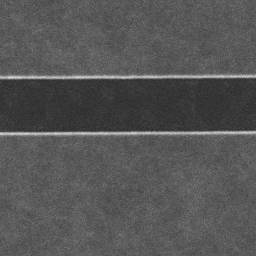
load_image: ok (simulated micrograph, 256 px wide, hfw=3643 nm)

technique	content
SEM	one or a few lines or trenches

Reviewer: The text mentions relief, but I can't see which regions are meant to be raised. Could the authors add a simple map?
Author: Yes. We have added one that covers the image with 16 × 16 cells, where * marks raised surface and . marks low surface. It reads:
****************
****************
****************
****************
****************
................
................
................
****************
****************
****************
****************
****************
****************
****************
****************